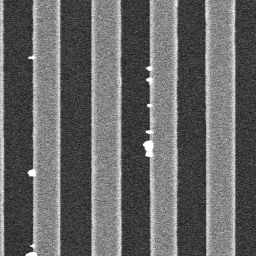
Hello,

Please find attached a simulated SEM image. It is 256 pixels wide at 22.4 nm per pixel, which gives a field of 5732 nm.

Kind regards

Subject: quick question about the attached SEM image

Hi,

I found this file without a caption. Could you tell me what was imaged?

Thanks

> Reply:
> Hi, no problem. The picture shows lines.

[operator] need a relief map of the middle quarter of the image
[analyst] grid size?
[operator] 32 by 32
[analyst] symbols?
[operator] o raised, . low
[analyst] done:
.......ooooooo.......ooooooo....
.......ooooooo.......ooooooo....
.......ooooooo........oooooo....
.......ooooooo.......ooooooo....
.......ooooooo.......ooooooo....
.......ooooooo........oooooo....
.......ooooooo........oooooo....
.......ooooooo........oooooo....
.......ooooooo........oooooo....
.......ooooooo........oooooo....
.......ooooooo.......ooooooo....
.......ooooooo........oooooo....
.......ooooooo........oooooo....
.......ooooooo........oooooo....
.......ooooooo........oooooo....
.......ooooooo........oooooo....
.......ooooooo.......ooooooo....
.......ooooooo.......ooooooo....
.......ooooooo........oooooo....
.......ooooooo.......ooooooo....
.......ooooooo......oooooooo....
.......ooooooo......oooooooo....
.......ooooooo.......ooooooo....
.......ooooooo........oooooo....
.......ooooooo........oooooo....
.......ooooooo........oooooo....
.......ooooooo........oooooo....
.......ooooooo........oooooo....
.......ooooooo........oooooo....
.......ooooooo........oooooo....
.......ooooooo........oooooo....
.......ooooooo........oooooo....